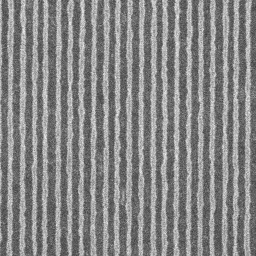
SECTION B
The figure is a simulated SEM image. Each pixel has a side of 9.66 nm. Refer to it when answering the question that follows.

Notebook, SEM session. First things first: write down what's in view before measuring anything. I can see parallel lines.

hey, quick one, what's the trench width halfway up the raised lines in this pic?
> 78.5 nanometres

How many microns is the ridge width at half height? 0.035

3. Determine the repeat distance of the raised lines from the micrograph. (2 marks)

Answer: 115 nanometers